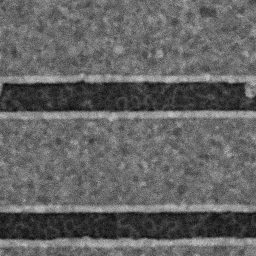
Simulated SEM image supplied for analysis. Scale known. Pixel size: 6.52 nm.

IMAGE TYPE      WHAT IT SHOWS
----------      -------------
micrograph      one or a few lines or trenches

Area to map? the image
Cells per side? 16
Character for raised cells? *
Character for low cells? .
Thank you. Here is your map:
****************
****************
****************
****************
****************
................
................
****************
****************
****************
****************
****************
****************
................
................
****************